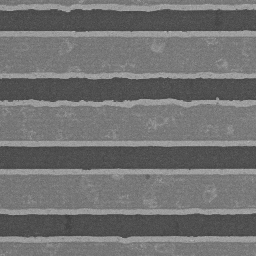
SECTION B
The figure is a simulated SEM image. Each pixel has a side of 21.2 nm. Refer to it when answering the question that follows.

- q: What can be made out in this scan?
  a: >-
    one or a few lines or trenches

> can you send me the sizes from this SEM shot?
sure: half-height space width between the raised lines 0.592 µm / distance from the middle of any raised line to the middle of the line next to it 1.46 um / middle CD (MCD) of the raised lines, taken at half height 860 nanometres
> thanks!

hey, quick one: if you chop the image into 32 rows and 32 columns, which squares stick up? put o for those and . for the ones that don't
oooooooooooooooooooooooooooooooo
................................
................................
................................
oooooooooooooooooooooooooooooooo
oooooooooooooooooooooooooooooooo
oooooooooooooooooooooooooooooooo
oooooooooooooooooooooooooooooooo
oooooooooooooooooooooooooooooooo
.o.o......ooo...................
................................
................................
................................
oooooooooooooooooooooooooooooooo
oooooooooooooooooooooooooooooooo
oooooooooooooooooooooooooooooooo
oooooooooooooooooooooooooooooooo
oooooooooooooooooooooooooooooooo
................................
................................
................................
........oo..oooo..o........o.ooo
oooooooooooooooooooooooooooooooo
oooooooooooooooooooooooooooooooo
oooooooooooooooooooooooooooooooo
oooooooooooooooooooooooooooooooo
.oo.....oo.....o................
................................
................................
................................
oooooooooooooooooooooooooooooooo
oooooooooooooooooooooooooooooooo